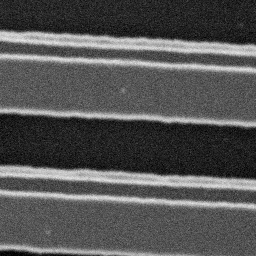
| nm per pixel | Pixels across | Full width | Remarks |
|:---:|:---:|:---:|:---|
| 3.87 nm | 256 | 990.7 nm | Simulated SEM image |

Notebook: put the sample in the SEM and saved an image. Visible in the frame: lines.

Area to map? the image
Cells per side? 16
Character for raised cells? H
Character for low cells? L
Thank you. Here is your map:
LLLLLLLLLLLLLLLL
LLLLLLLLLLLLLLLL
HHHHHHHHHLLLLLLL
HHHHHHHHHHHHHHHH
HHHHHHHHHHHHHHHH
HHHHHHHHHHHHHHHH
HHHHHHHHHHHHHHHH
LLLLLLLLLLHHHHHH
LLLLLLLLLLLLLLLL
LLLLLLLLLLLLLLLL
HHLLLLLLLLLLLLLL
HHHHHHHHHHHHHHHH
HHHHHHHHHHHHHHHH
HHHHHHHHHHHHHHHH
HHHHHHHHHHHHHHHH
HHHHHHHHHHHHHHHH